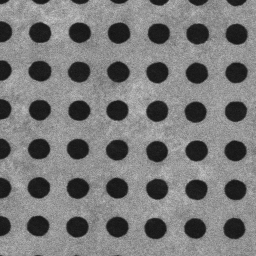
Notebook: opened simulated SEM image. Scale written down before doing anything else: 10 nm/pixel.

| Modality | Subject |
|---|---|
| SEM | a regular array of holes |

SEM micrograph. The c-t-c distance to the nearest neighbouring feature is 386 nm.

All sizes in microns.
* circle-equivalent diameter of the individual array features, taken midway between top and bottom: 0.215